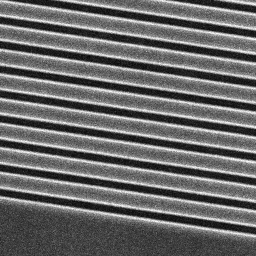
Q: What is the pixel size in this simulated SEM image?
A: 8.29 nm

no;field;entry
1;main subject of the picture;parallel lines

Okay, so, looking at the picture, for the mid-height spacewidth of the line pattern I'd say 73.8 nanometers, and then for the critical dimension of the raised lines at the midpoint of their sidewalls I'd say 132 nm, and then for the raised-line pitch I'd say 202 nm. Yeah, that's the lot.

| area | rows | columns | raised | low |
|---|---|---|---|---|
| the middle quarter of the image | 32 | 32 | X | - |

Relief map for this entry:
XXXXXXXXXXX----------------XXXXX
XXXXXXXXXXXXXXXXXX--------------
XXXXXXXXXXXXXXXXXXXXXXXXX-------
-----XXXXXXXXXXXXXXXXXXXXXXXXXX-
------------XXXXXXXXXXXXXXXXXXXX
XXXX---------------XXXXXXXXXXXXX
XXXXXXXXXXX--------------XXXXXXX
XXXXXXXXXXXXXXXXXX--------------
XXXXXXXXXXXXXXXXXXXXXXXX--------
-----XXXXXXXXXXXXXXXXXXXXXXXXXX-
------------XXXXXXXXXXXXXXXXXXXX
XX----------------XXXXXXXXXXXXXX
XXXXXXXXX----------------XXXXXXX
XXXXXXXXXXXXXXXX---------------X
XXXXXXXXXXXXXXXXXXXXXX----------
-----XXXXXXXXXXXXXXXXXXXXXXXX---
----------XXXXXXXXXXXXXXXXXXXXXX
XX----------------XXXXXXXXXXXXXX
XXXXXXXXX--------------XXXXXXXXX
XXXXXXXXXXXXXXX---------------XX
XXXXXXXXXXXXXXXXXXXXXX----------
---XXXXXXXXXXXXXXXXXXXXXXXXX----
---------XXXXXXXXXXXXXXXXXXXXXXX
----------------XXXXXXXXXXXXXXXX
XXXXXXX---------------XXXXXXXXXX
XXXXXXXXXXXXX----------------XXX
XXXXXXXXXXXXXXXXXXXX------------
--XXXXXXXXXXXXXXXXXXXXXXXXX-----
---------XXXXXXXXXXXXXXXXXXXXXXX
---------------XXXXXXXXXXXXXXXXX
XXXXXX----------------XXXXXXXXXX
XXXXXXXXXXXXX----------------XXX